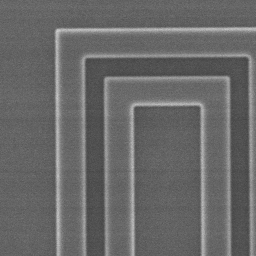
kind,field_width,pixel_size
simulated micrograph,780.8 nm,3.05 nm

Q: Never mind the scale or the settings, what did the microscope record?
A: groups of lines, slits or small figures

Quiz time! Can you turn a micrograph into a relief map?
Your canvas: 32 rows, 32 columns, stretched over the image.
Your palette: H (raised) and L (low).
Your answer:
LLLLLLLLLLLLLLLLLLLLLLLLLLLLLLLL
LLLLLLLLLLLLLLLLLLLLLLLLLLLLLLLL
LLLLLLLLLLLLLLLLLLLLLLLLLLLLLLLL
LLLLLLLLLLLLLLLLLLLLLLLLLLLLLLLL
LLLLLLLHHHHHHHHHHHHHHHHHHHHHHHHH
LLLLLLLHHHHHHHHHHHHHHHHHHHHHHHHH
LLLLLLLHHHHHHHHHHHHHHHHHHHHHHHHH
LLLLLLLHHHHLLLLLLLLLLLLLLLLLLLLH
LLLLLLLHHHLLLLLLLLLLLLLLLLLLLLLH
LLLLLLLHHHHLLLLLLLLLLLLLLLLLLLLH
LLLLLLLHHHHLLHHHHHHHHHHHHHHHHLLH
LLLLLLLHHHHLLHHHHHHHHHHHHHHHHLLH
LLLLLLLHHHHLLHHHHHHHHHHHHHHHHLLH
LLLLLLLHHHHLLHHHHLLLLLLLLHHHHLLH
LLLLLLLHHHHLLHHHHLLLLLLLLHHHHLLH
LLLLLLLHHHHLLHHHHLLLLLLLLHHHHLLH
LLLLLLLHHHHLLHHHHLLLLLLLLHHHHLLH
LLLLLLLHHHHLLHHHHLLLLLLLLHHHHLLH
LLLLLLLHHHHLLHHHHLLLLLLLLHHHHLLH
LLLLLLLHHHHLLHHHHLLLLLLLLHHHHLLH
LLLLLLLHHHHLLHHHHLLLLLLLLHHHHLLH
LLLLLLLHHHHLLHHHHLLLLLLLLHHHHLLH
LLLLLLLHHHHLLHHHHLLLLLLLLHHHHLLH
LLLLLLLHHHHLLHHHHLLLLLLLLHHHHLLH
LLLLLLLHHHHLLHHHHLLLLLLLLHHHHLLH
LLLLLLLHHHHLLHHHHLLLLLLLLHHHHLLH
LLLLLLLHHHHLLHHHHLLLLLLLLHHHHLLH
LLLLLLLHHHHLLHHHHLLLLLLLLHHHHLLH
LLLLLLLHHHHLLHHHHLLLLLLLLHHHHLLH
LLLLLLLHHHHLLHHHHLLLLLLLLHHHHLLH
LLLLLLLHHHHLLHHHHLLLLLLLLHHHHLLH
LLLLLLLHHHHLLHHHHLLLLLLLLHHHHLLH